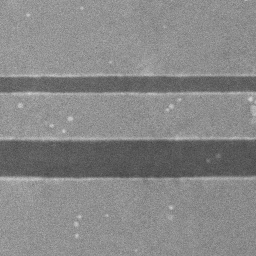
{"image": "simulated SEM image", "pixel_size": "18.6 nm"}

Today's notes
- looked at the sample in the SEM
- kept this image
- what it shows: lines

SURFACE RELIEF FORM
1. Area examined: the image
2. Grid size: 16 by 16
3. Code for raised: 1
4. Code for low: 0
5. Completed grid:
1111111111111111
1111111111111111
1111111111111111
1111111111111111
1111111111111111
1111111111111111
1111111111111111
1111111111111111
1111111111111111
0000000000000000
0000000000000000
1111111111111111
1111111111111111
1111111111111111
1111111111111111
1111111111111111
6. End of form